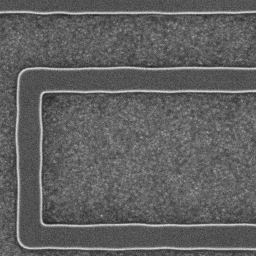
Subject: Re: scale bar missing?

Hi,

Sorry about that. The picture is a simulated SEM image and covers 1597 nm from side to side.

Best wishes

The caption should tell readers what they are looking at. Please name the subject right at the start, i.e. groups of lines, slits or small figures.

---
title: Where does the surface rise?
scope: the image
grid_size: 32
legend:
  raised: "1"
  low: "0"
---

11111111111111111111111111111111
11111111111111111111111111111111
00000000000000000000000000000000
00000000000000000000000000000000
00000000000000000000000000000000
00000000000000000000000000000000
00000000000000000000000000000000
00000000000000000000000000000000
00000100000001111100001111111000
00111111111111111111111111111111
00111111111111111111111111111111
00111110011101100000110000001100
00111000000000000000000000000000
00111000000000000000000000000000
00111000000000000000000000000000
00111000000000000000000000000000
00111000000000000000000000000000
00111000000000000000000000000000
00111000000000000000000000000000
00111000000000000000000000000000
00111000000000000000000000000000
00111000000000000000000000000000
00111000000000000000000000000000
00111000000000000000000000000000
00111000000000000000000000000000
00111000000000000000000000000000
00111000000000000000000000000000
00111000000000000000000000000000
00111111111111111111111111111111
00111111111111111111111111111111
00011111111111111111111111111111
00000000000000000000000000000000